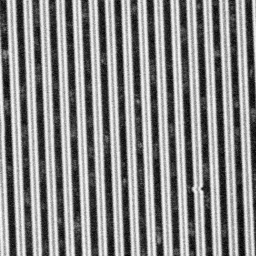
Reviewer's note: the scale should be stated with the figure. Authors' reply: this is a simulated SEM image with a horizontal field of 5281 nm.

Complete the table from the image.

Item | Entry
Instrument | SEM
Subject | parallel lines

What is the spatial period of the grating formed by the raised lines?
337 nm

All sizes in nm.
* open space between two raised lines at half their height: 206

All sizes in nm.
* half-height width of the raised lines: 139